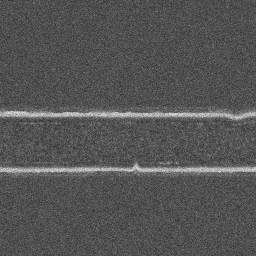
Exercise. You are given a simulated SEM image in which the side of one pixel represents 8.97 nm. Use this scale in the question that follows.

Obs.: one or a few lines or trenches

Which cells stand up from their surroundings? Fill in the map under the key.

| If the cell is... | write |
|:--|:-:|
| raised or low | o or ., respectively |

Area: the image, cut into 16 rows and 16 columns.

oooooooooooooooo
oooooooooooooooo
oooooooooooooooo
oooooooooooooooo
oooooooooooooooo
oooooooooooooooo
oooooooooooooooo
................
................
................
................
oooooooooooooooo
oooooooooooooooo
oooooooooooooooo
oooooooooooooooo
oooooooooooooooo